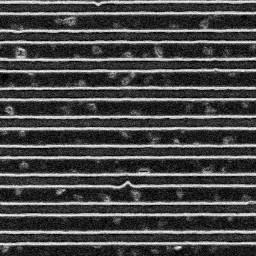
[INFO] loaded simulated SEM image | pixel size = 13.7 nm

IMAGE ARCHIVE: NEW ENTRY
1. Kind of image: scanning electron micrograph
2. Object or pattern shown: parallel lines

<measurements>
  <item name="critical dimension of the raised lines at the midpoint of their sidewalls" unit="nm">250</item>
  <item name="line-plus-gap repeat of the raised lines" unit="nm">394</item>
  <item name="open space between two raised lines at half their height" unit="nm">144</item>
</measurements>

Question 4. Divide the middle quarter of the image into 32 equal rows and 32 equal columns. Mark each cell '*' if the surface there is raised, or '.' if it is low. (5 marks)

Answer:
................................
...............................*
********************************
********************************
********************************
********************************
................................
................................
................................
********************************
********************************
********************************
********************************
................................
................................
................................
********************************
********************************
********************************
********************************
..*******************.**********
................................
................................
********************************
********************************
********************************
********************************
********************************
................................
................................
...****...**..****.****.********
********************************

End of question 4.